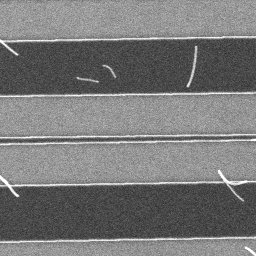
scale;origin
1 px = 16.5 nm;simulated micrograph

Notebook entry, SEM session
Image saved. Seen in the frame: lines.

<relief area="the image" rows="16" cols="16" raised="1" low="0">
0000000000000000
0000000000000000
0000011111111111
1111111111111111
1111111111111111
1111111111111111
0000000000000000
0000000000000000
0000000000000000
0000000000000000
0000000000000000
1000000111111111
1111111111111111
1111111111111111
1111111111111111
0000000000000000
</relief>